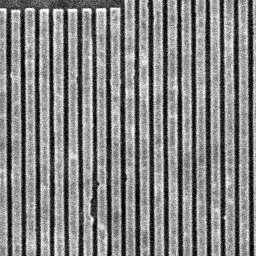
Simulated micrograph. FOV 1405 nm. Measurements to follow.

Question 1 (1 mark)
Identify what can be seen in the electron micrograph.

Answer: parallel lines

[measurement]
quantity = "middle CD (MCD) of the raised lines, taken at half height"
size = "46.6 nanometres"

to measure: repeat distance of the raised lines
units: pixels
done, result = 14.2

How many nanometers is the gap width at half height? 30.9